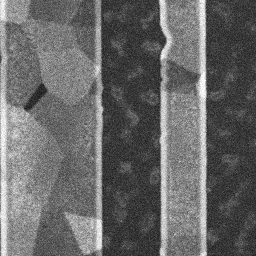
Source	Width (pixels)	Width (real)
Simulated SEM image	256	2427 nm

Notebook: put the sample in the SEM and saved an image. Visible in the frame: one or a few lines or trenches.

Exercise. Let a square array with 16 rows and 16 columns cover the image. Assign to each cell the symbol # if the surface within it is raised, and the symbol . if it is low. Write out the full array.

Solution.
######....###...
######....###...
######.....##...
######....###...
######....###...
######....###...
######....###...
######....###...
######....###...
######....###...
######....###...
######....###...
######....###...
######....###...
######....###...
######....###...